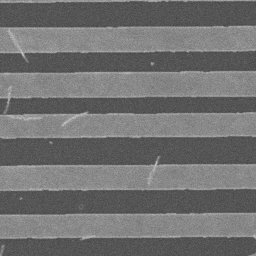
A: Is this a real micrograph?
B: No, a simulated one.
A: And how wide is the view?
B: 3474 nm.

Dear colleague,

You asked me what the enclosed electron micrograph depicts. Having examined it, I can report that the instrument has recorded lines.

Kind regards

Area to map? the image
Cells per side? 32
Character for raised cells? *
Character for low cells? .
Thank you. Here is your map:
................................
................................
................................
.............*******************
********************************
********************************
*******...*.....................
................................
................................
********************************
********************************
********************************
................................
................................
********************************
********************************
********************************
................................
................................
................................
...................*............
********************************
********************************
********************************
................................
................................
................................
********************************
********************************
********************************
................................
................................